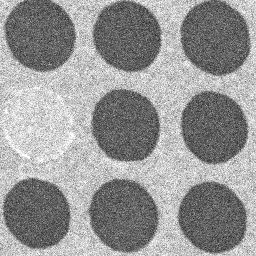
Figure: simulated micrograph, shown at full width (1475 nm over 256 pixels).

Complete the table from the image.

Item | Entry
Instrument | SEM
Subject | holes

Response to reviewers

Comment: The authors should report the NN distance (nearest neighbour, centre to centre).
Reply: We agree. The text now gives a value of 509 nm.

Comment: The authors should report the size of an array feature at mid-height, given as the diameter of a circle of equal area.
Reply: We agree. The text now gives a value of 405 nanometres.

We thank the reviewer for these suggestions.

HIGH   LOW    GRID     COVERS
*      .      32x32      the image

**.....*******...********...****
*.......*****......*****......**
*........***........***........*
*........***........***........*
*.........**........***........*
*........***........***........*
*........***........***........*
**......*****......*****.......*
***....*******....*******.....**
***************************.****
********************************
**************...********..*****
************.......*****.....***
************.......****.......**
************........***........*
***********.........***........*
************........***........*
************........***........*
************.......****.......**
*************......*****.....***
**************************.*****
********************************
***..*********..****************
**.....*****......******.....***
*.......****.......****.......**
.........**.........***.......**
.........**.........**.........*
*........**.........**.........*
*........***........**.........*
**......****.......****........*
***....******......*****......**
****************.*********..****